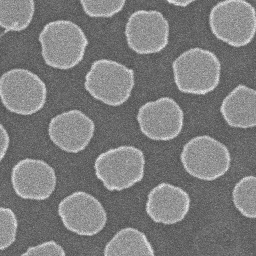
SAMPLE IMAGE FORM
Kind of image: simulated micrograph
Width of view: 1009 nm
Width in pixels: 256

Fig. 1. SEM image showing a regular array of raised bodies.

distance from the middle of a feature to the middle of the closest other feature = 235 nanometers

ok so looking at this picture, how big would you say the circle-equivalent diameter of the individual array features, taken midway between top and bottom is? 43.5 px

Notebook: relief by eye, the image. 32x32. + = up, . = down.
++++......+++++.......+....++++.
++++.......+++...+++......++++++
++++............+++++.....++++++
.++...++++......+++++.....++++++
.....+++++......+++++......++++.
.....++++++.....+++++........++.
.....+++++.......++....+++......
......++++............+++++.....
...........+++++......+++++.....
++++.......++++++.....+++++.....
+++++......++++++.....+++++.....
++++++.....+++++........++...+++
++++++.......+++....++......++++
.++++.............++++......++++
.......++++......++++++.....++++
......++++++......+++++......+++
+.....++++++......++++..........
+......++++.............+++.....
+.......++.....++......+++++....
.............+++++.....++++++...
..++++......++++++.....++++++...
..+++++.....++++++......++++....
..+++++......++++.............++
..+++++.......++...+++.......+++
...+++...++........++++......+++
........+++++.....++++++.....+++
+......++++++......++++.......++
++......+++++......++++.........
++.......++++...................
++............++++..............
+....++......++++++.............
...+++++.....++++++.............